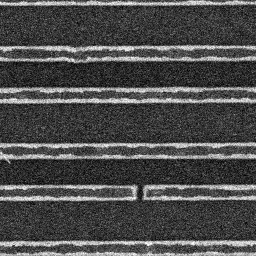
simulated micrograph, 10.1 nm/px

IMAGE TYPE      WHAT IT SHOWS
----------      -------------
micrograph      parallel lines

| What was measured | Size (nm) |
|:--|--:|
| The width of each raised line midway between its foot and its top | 139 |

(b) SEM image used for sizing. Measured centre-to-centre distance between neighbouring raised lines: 0.474 microns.